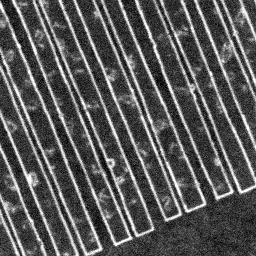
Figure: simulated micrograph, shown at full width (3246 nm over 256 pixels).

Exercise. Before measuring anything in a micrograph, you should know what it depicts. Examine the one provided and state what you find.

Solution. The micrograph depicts parallel lines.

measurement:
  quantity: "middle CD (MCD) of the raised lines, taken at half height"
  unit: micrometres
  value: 0.227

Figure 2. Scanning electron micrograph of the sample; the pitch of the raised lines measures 352 nanometers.